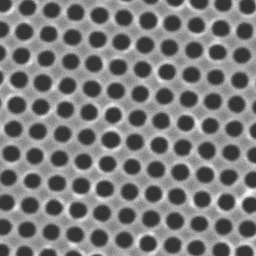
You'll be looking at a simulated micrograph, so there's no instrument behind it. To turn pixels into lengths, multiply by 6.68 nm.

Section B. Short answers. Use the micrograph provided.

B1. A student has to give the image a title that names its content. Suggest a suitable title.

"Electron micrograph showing a regular array of holes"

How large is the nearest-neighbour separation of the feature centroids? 161 nanometres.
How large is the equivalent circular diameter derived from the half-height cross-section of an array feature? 121 nm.